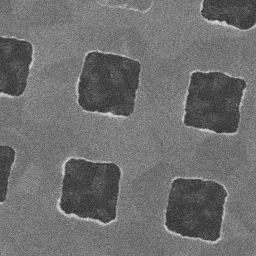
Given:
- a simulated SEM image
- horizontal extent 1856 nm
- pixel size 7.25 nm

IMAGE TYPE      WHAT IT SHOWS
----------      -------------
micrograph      holes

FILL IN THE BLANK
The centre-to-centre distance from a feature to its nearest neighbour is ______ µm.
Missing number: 0.775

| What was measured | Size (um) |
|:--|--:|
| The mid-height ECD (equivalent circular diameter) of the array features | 0.45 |